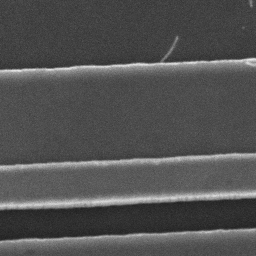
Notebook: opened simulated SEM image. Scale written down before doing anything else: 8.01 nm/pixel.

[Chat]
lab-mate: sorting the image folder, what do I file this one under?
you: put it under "lines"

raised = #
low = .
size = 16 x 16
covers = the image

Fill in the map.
................
................
................
................
################
################
################
################
################
################
################
################
#########.......
................
............####
################